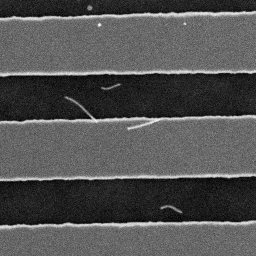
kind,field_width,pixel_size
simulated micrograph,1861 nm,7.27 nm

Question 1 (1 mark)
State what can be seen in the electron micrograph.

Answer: lines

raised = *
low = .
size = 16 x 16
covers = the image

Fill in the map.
................
****************
****************
****************
****************
................
................
..**************
****************
****************
****************
................
................
................
****************
****************